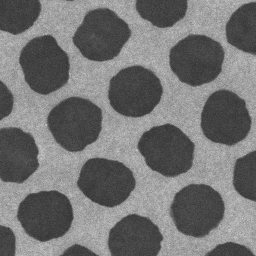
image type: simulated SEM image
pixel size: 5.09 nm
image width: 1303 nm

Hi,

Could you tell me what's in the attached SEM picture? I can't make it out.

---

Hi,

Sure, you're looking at a regular array of holes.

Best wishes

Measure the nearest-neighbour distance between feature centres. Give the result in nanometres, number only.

334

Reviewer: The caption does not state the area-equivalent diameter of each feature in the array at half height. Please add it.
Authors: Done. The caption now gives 269 nm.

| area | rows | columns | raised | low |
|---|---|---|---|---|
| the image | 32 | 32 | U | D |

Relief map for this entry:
DDDDDUUUUUUUUUUUUDDDDDDUUUUUUUUD
DDDDDUUUUUUDDDUUUDDDDDDUUUUUUDDD
DDDDDUUUUUDDDDDUUUDDDDUUUUUUUDDD
DDDDUUUUUUDDDDDDUUUUUUUUUUUUDDDD
UUUUUDUUUDDDDDDDUUUUUUUUDDUUDDDD
UUUDDDDUUDDDDDDDUUUUUUDDDDDUUDDD
UUUDDDDDUUDDDDDUUUUUUDDDDDDDUUUD
UUDDDDDDDUUDDDUUUUUUUDDDDDDDUUUU
UUUDDDDDDUUUUUUUDDUUUDDDDDDDUUUU
UUUDDDDDDUUUUUDDDDDDUUDDDDDUUUUU
UUUDDDDDUUUUUUDDDDDDUUUUDUUUUUUU
DUUUDDUUUUUUUUDDDDDDUUUUUUUDDUUU
DDUUUUUUDDDUUUDDDDDDUUUUUUDDDDUU
DDUUUUUDDDDDUUDDDDDUUUUUUDDDDDDU
DUUUUUDDDDDDDUUUDDUUUUUUUDDDDDDU
UUUUUUDDDDDDDUUUUUUUUUUUUDDDDDDU
DDDUUUDDDDDDDUUUUUDDDDDUUDDDDDDU
DDDDUUUDDDDDUUUUUDDDDDDDUUDDDDUU
DDDDDUUUDDDUUUUUUDDDDDDDUUUUUUUU
DDDDDUUUUUUUUUUUUUDDDDDDUUUUUUUD
DDDDDUUUUUUDDDDUUUDDDDDDUUUUUDDD
DDDDUUUUUUDDDDDDUUUUDDDUUUUUUDDD
DDDUUUUUUUDDDDDDDUUUUUUUUUUUUDDD
UUUUUUUUUUDDDDDDDUUUUUUDDDDUUDDD
UUUDDDDDUUUDDDDDUUUUUUDDDDDDUUDD
UUUDDDDDDUUUDDDUUUUUUUDDDDDDUUUU
UUDDDDDDDUUUUUUUUUUUUDDDDDDDUUUU
UUDDDDDDDUUUUUUDDDDUUUDDDDDDUUUU
DUUDDDDDDUUUUUDDDDDDUUDDDDDUUUUU
DDUUDDDDUUUUUUDDDDDDUUUUDUUUUUUU
DDUUUUUUUUUUUUDDDDDDUUUUUUUUDDUU
DDUUUUUUDDDDUUDDDDDDUUUUUUDDDDDU